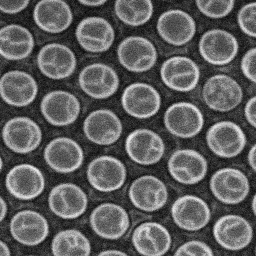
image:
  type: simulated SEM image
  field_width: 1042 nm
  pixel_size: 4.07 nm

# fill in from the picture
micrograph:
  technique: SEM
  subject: a regular array of raised bodies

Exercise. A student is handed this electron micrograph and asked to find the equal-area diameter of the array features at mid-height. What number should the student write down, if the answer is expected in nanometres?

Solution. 144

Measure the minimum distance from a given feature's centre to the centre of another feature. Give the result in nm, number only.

189